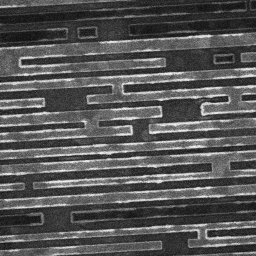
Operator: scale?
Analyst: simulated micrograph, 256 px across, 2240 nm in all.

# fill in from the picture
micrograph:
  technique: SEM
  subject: parallel lines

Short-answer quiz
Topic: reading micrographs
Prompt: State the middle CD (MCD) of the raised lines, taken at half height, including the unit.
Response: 84 nm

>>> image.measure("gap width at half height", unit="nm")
63.3